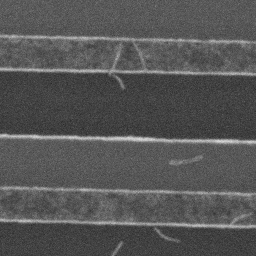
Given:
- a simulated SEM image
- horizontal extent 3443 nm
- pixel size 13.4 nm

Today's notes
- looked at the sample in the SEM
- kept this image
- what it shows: lines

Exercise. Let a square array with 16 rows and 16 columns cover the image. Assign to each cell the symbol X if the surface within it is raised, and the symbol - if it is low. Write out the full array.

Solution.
XXXXXXXXXXXXXXXX
XXXXXXXXXXXXXXXX
XXXXXXXXXXXXXXXX
XXXXXXXXXXXXXXXX
-----------XXXXX
----------------
----------------
----------------
XX--------------
XXXXXXXXXXXXXXXX
XXXXXXXXXXXXXXXX
XXXXXXXXXXXXXXXX
XXXXXXXXXXXXXXXX
XXXXXXXXXXXXXXXX
----------------
----------------